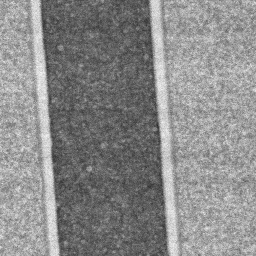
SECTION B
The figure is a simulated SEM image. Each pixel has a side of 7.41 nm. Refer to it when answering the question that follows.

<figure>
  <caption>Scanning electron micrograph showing one or a few lines or trenches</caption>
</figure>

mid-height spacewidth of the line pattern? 888 nm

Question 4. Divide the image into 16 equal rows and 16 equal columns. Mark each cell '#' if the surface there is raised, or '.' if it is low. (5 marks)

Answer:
##........######
##........######
##........######
##........######
###.......######
###.......######
###.......######
###.......######
###.......######
###.......######
###.......######
###........#####
###........#####
###........#####
###........#####
###........#####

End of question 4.